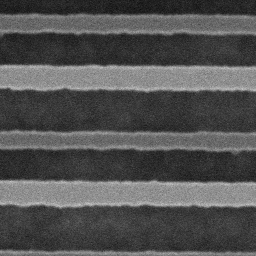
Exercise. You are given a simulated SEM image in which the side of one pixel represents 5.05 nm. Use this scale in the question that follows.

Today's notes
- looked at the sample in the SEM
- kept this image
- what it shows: lines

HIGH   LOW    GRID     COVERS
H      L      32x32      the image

LLLLLLLLLLLLLLLLLLLLLLLLLLLLLLLL
LLLLLLLLLLLLLLLLLLLLLLLLLLLLLLLL
HHHHHHHHHHHHHHHHHHHHHHHHHHHHHHHH
HHHHHHHHHHHHHHHHHHHHHHHHHHHHHHHH
LLLLLLLLLLLLLLLLLLLLLLLLLLLLLLLL
LLLLLLLLLLLLLLLLLLLLLLLLLLLLLLLL
LLLLLLLLLLLLLLLLLLLLLLLLLLLLLLLL
LLLLLLLLLLLLLLLLLLLLLLLLLLLLLLLL
HHHHHHHHHHHHHHHHHHHHHHHHHHHHHHHH
HHHHHHHHHHHHHHHHHHHHHHHHHHHHHHHH
HHHHHHHHHHHHHHHHHHHHHHHHHHHHHHHH
LLLLLLLLLLLLLLLLLLLLLLLLLLLLLLLL
LLLLLLLLLLLLLLLLLLLLLLLLLLLLLLLL
LLLLLLLLLLLLLLLLLLLLLLLLLLLLLLLL
LLLLLLLLLLLLLLLLLLLLLLLLLLLLLLLL
LLLLLLLLLLLLLLLLLLLLLLLLLLLLLLLL
LHHLHLLLLLLLLLLLLLLLLLLLLLLLLLLL
HHHHHHHHHHHHHHHHHHHHHHHHHHHHHHHH
HHHLHHHHHLHHHHHHHHHHHHHHHHHHHHHH
LLLLLLLLLLLLLLLLLLLLLLLLLLLLLLLL
LLLLLLLLLLLLLLLLLLLLLLLLLLLLLLLL
LLLLLLLLLLLLLLLLLLLLLLLLLLLLLLLL
LLLLLLLLLLLLLLLLLLLLLLLLLLLLLLLL
HHHHHHHHHHHHHHHHHHHHHHHHHHHHHHHH
HHHHHHHHHHHHHHHHHHHHHHHHHHHHHHHH
HLHHHHHHHHHHHHHHHHHHHHHHHHHHHHHH
LLLLLLLLLLLLLLLLLLLLLLLLLLLLLLLL
LLLLLLLLLLLLLLLLLLLLLLLLLLLLLLLL
LLLLLLLLLLLLLLLLLLLLLLLLLLLLLLLL
LLLLLLLLLLLLLLLLLLLLLLLLLLLLLLLL
LLLLLLLLLLLLLLLLLLLLLLLLLLLLLLLL
HHHHHHLHHHHHLHLLLLHHLLLLLLLLLLLL